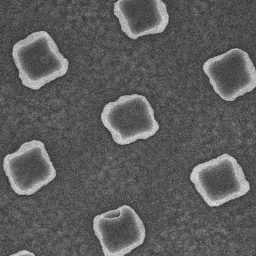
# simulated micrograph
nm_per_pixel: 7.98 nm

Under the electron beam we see raised bodies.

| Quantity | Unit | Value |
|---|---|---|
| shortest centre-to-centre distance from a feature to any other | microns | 0.862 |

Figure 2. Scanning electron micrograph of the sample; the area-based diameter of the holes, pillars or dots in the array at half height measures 372 nanometres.